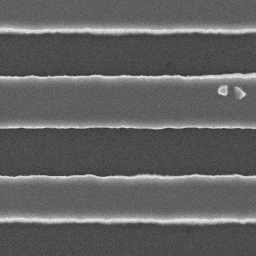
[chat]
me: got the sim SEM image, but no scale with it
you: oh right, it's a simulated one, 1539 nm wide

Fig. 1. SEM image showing lines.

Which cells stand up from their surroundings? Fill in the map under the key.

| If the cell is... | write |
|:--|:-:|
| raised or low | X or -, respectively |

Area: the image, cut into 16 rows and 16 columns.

XXXXXXXXXXXXXXXX
XXXXXXXXXXXXXXXX
----------------
----------------
----------------
XXXXXXXXXXXXXXXX
XXXXXXXXXXXXXXXX
XXXXXXXXXXXXXXXX
----------------
----------------
----------------
XXXXXXXXXXXXXXXX
XXXXXXXXXXXXXXXX
XXXXXXXXXXXXXXXX
----------------
----------------